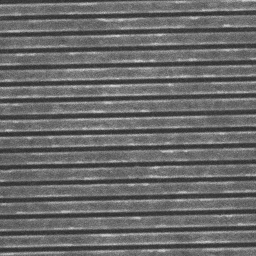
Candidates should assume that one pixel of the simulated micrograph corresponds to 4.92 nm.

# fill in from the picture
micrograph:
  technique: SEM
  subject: parallel lines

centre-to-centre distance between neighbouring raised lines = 81.4 nanometers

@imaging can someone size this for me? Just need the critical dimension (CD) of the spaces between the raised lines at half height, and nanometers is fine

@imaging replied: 24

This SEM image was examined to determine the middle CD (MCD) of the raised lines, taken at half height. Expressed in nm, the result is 57.8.